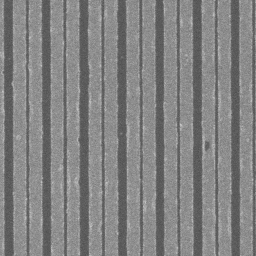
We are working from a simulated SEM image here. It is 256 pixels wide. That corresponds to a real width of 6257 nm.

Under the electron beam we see parallel lines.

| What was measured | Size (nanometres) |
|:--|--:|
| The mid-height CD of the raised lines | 306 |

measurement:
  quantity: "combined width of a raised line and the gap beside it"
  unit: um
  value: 0.461